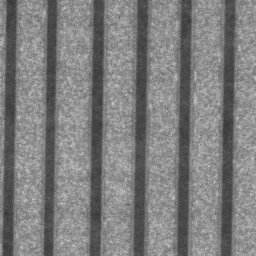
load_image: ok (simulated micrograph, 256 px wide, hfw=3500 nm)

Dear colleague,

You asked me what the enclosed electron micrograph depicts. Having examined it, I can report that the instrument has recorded parallel lines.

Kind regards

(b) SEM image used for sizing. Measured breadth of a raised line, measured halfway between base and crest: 176 nm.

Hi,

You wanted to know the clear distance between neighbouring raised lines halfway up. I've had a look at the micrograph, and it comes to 425 nanometers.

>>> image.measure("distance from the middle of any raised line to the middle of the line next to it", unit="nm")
597